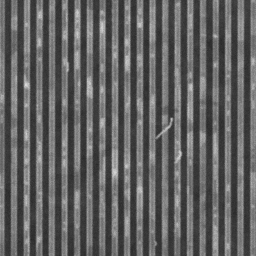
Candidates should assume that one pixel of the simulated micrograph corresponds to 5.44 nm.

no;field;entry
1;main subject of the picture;parallel lines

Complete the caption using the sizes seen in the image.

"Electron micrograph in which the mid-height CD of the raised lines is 0.0251 µm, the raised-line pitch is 68.4 nanometres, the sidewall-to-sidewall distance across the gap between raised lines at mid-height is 40.1 nm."